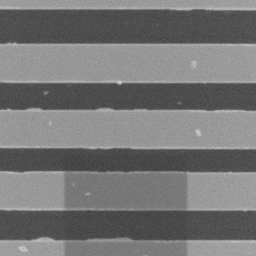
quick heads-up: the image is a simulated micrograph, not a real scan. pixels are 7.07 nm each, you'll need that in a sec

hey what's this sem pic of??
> lines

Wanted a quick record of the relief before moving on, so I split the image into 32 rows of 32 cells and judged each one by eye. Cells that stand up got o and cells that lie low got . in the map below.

oooooooooooooooooooooooooooooooo
................................
................................
................................
................................
.o..............................
oooooooooooooooooooooooooooooooo
oooooooooooooooooooooooooooooooo
oooooooooooooooooooooooooooooooo
oooooooooooooooooooooooooooooooo
................................
................................
................................
................................
oooooooooooooooooooooooooooooooo
oooooooooooooooooooooooooooooooo
oooooooooooooooooooooooooooooooo
oooooooooooooooooooooooooooooooo
.............o..oooooooooooooooo
................................
................................
................................
oooooooooooooooooooooooooooooooo
oooooooooooooooooooooooooooooooo
oooooooooooooooooooooooooooooooo
oooooooooooooooooooooooooooooooo
................................
................................
................................
................................
oooooooooooooooooooooooooooooooo
oooooooooooooooooooooooooooooooo